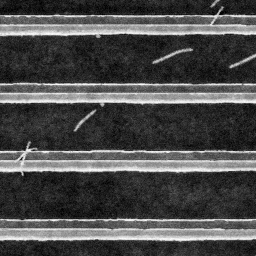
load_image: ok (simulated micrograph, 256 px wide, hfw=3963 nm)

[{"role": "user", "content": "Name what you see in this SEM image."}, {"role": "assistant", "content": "lines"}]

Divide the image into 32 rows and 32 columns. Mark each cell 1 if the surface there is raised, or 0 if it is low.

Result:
00000000000000000000000000000000
00000000000000000000000000000000
11111111111111111111111111111111
11111111111111111111111111111111
00000000000000000000000000000000
00000000000000000000000000000000
00000000000000000000000000000000
00000000000000000000000000000000
00000000000000000000000000000000
00000000000000000000000000000000
00000000000000000000000000000000
11111111111111111111111111111111
11111111111111111111111111111111
00000000000000000000000000000000
00000000000000000000000000000000
00000000000000000000000000000000
00000000000000000000000000000000
00000000000000000000000000000000
00000000000000000000000000000000
11111111111111111111111111111111
11111111111111111111111111111111
00000000000000000000000000000000
00000000000000000000000000000000
00000000000000000000000000000000
00000000000000000000000000000000
00000000000000000000000000000000
00000000000000000000000000000000
10000011110111111110010000111001
11111111111111111111111111111111
11111111111111111111111111111111
00000000000000000000000000000000
00000000000000000000000000000000